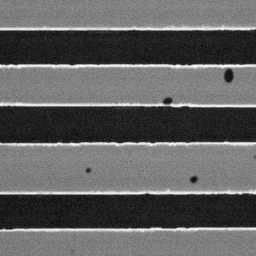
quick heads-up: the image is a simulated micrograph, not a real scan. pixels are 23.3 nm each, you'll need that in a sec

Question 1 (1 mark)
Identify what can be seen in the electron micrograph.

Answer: lines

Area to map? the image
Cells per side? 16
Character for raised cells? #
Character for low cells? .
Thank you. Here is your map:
################
################
................
................
################
################
################
................
................
################
################
################
................
................
################
################